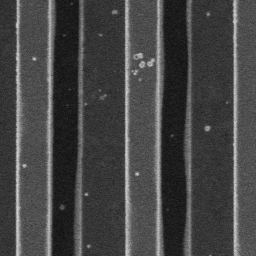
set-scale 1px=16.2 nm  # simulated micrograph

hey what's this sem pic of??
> lines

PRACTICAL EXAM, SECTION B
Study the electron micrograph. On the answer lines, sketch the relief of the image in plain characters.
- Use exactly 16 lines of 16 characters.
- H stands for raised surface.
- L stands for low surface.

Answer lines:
HHHLLHHHHHLLHHHH
HHHLLHHHHHLLHHHH
HHHLLHHHHHLLHHHH
HHHLLHHHHHLLHHHH
HHHLLHHHHHLLHHHH
HHHLLHHHHHLLHHHH
HHHLLHHHHHLLHHHH
HHHLLHHHHHLLHHHH
HHHLLHHHHHLLHHHH
HHHLLHHHHHLLHHHH
HHHLLHHHHHLLHHHH
HHHLLHHHHHLLHHHH
HHHLLHHHHHLLHHHH
HHHLLHHHHHLLHHHH
HHHLLHHHHHLLHHHH
HHHLLHHHHHLLHHHH